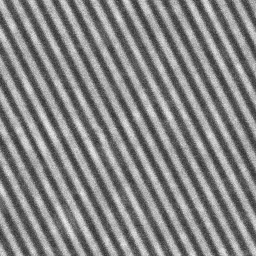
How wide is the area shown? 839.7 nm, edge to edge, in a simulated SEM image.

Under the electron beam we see parallel lines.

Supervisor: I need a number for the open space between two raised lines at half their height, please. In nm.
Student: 27.8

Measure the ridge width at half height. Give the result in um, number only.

0.0156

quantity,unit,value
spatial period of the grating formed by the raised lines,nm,46.1